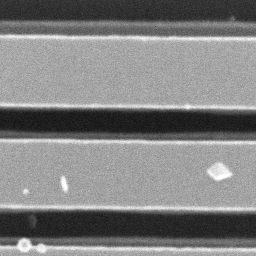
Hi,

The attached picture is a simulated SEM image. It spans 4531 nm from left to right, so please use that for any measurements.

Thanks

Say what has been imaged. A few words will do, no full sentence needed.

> lines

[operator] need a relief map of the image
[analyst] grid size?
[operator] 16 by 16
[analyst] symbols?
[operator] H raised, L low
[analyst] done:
LLLLLLLLLLLLLLLL
LLLLLLLLLLLLLLLL
HHHHHHHHHHHHHHHH
HHHHHHHHHHHHHHHH
HHHHHHHHHHHHHHHH
HHHHHHHHHHHHHHHH
HHHHHHHHHHHHHHHH
LLLLLLLLLLLLLLLL
LLLLLLLLLLLLLLLL
HHHHHHHHHHHHHHHH
HHHHHHHHHHHHHHHH
HHHHHHHHHHHHHHHH
HHHHHHHHHHHHHHHH
LLLLLLLLLLLLLLLL
LLLLLLLLLLLLLLLL
HHHHHHHLLLLLLLLL